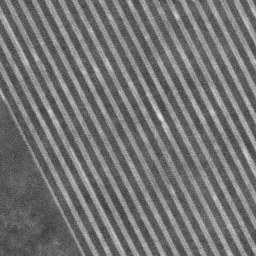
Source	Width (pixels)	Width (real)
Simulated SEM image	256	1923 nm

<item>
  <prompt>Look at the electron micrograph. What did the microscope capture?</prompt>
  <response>parallel lines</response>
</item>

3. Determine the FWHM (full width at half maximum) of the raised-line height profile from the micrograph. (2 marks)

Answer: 30.1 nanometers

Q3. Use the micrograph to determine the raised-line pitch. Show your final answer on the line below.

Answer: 0.0902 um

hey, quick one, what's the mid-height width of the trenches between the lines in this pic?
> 8.03 pixels